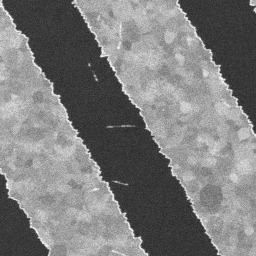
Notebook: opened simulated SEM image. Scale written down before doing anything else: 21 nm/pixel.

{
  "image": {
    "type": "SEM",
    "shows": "one or a few lines or trenches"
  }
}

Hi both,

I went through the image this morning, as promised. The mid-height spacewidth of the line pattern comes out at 1350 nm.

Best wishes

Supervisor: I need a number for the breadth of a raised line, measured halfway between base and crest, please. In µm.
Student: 1.85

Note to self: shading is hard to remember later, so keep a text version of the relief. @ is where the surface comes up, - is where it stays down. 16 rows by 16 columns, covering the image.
-----@@@@@@-----
@----@@@@@@@----
@@----@@@@@@@---
@@-----@@@@@@---
@@@----@@@@@@@--
@@@-----@@@@@@--
@@@@----@@@@@@@-
@@@@-----@@@@@@@
@@@@@-----@@@@@@
@@@@@-----@@@@@@
@@@@@@-----@@@@@
@@@@@@@----@@@@@
-@@@@@@-----@@@@
--@@@@@@----@@@@
--@@@@@@-----@@@
---@@@@@@-----@@